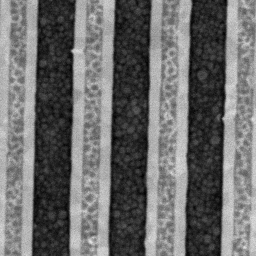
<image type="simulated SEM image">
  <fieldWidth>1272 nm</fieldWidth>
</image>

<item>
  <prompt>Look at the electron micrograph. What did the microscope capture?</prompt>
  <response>one or a few lines or trenches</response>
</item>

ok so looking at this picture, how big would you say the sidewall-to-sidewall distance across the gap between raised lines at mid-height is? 235 nm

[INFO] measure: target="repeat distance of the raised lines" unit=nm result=378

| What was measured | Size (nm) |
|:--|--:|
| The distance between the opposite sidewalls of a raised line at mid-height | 143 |